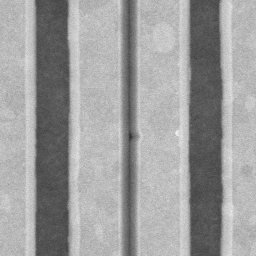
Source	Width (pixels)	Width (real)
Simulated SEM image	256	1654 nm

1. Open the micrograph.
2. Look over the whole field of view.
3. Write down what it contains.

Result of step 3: one or a few lines or trenches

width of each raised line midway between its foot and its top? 0.308 micrometres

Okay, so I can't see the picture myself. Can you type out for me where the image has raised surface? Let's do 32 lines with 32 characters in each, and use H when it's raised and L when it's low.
HHHHLLLLLHHHHHHLLHHHHHHLLLLLHHHH
HHHHLLLLLHHHHHHLLHHHHHHLLLLLHHHH
HHHHLLLLLHHHHHHLLHHHHHHLLLLLHHHH
HHHHLLLLLHHHHHHLLHHHHHHLLLLLHHHH
HHHHLLLLLHHHHHHLLHHHHHHLLLLLHHHH
HHHHLLLLLHHHHHHLLHHHHHHLLLLLHHHH
HHHHLLLLLHHHHHHLLHHHHHHLLLLLHHHH
HHHHLLLLLHHHHHHLLHHHHHHLLLLLHHHH
HHHHLLLLLHHHHHHLLHHHHHHLLLLLHHHH
HHHHLLLLLHHHHHHLLHHHHHHLLLLLLHHH
HHHHLLLLLHHHHHHLLHHHHHHLLLLLLHHH
HHHHLLLLLHHHHHHLLHHHHHHLLLLLLHHH
HHHHLLLLLLHHHHHLLHHHHHHLLLLLLHHH
HHHHLLLLLLHHHHHLLHHHHHHLLLLLLHHH
HHHHLLLLLHHHHHHLLHHHHHHLLLLLHHHH
HHHHLLLLLHHHHHHLLHHHHHHLLLLLLHHH
HHHHLLLLLHHHHHHLLHHHHHHLLLLLLHHH
HHHHLLLLLHHHHHHLLHHHHHHLLLLLHHHH
HHHHLLLLLHHHHHHLLHHHHHHLLLLLHHHH
HHHHLLLLLHHHHHHLLHHHHHHLLLLLHHHH
HHHHLLLLLHHHHHHLLHHHHHHLLLLLHHHH
HHHHLLLLLHHHHHHLLHHHHHHLLLLLHHHH
HHHHLLLLLHHHHHHLLHHHHHHLLLLLHHHH
HHHHLLLLLHHHHHHLLHHHHHHLLLLLHHHH
HHHHLLLLLHHHHHHLLHHHHHHLLLLLHHHH
HHHHLLLLLHHHHHHLLHHHHHHLLLLLLHHH
HHHHLLLLLHHHHHHLLHHHHHHLLLLLLHHH
HHHHLLLLLHHHHHHLLHHHHHHLLLLLLHHH
HHHHLLLLLHHHHHHLLHHHHHHLLLLLHHHH
HHHHLLLLLLHHHHHLLHHHHHHLLLLLHHHH
HHHHLLLLLLHHHHHLLHHHHHHLLLLLHHHH
HHHHLLLLLLHHHHHLLHHHHHHLLLLLHHHH